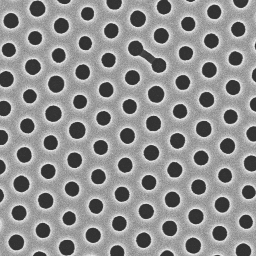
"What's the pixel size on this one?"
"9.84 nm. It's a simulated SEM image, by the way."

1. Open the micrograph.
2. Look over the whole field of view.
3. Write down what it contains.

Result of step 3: a regular array of holes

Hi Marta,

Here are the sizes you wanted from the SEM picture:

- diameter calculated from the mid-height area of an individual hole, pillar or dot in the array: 148 nanometers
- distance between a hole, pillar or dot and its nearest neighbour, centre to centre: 28.8 pixels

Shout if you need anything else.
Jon